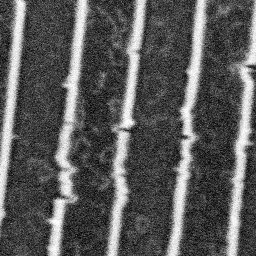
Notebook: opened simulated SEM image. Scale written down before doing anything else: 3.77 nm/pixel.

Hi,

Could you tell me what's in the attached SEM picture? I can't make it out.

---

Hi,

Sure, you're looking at one or a few lines or trenches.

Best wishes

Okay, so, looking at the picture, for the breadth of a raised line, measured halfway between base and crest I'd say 0.225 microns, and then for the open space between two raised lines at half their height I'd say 220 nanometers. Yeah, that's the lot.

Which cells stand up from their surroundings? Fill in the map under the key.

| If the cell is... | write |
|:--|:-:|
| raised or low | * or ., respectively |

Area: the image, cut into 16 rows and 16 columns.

*....****...****
*....****...****
*....****...****
*....***....****
*....***....***.
*...****....****
*...****....***.
*...****....***.
*...****....***.
....****....***.
....***....****.
....****...****.
....****...****.
....***....****.
...****....****.
...****....****.